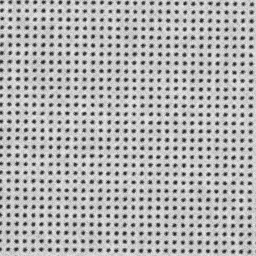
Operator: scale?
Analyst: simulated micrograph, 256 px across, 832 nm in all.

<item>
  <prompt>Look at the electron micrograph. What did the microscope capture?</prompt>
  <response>a regular array of holes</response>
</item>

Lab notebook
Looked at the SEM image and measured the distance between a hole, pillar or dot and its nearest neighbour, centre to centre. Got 25.7 nm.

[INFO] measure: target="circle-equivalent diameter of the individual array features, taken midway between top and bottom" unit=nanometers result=14.7